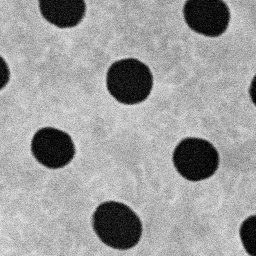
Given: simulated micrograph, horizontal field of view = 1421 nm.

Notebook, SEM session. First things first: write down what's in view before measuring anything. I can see holes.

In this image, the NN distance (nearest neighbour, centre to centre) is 561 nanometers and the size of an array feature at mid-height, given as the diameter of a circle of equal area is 46.6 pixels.